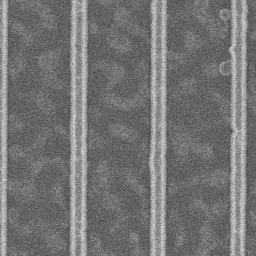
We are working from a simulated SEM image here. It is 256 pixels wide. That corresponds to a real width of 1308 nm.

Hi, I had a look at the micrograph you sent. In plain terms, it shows one or a few lines or trenches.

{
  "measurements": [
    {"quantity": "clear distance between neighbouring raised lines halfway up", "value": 67.3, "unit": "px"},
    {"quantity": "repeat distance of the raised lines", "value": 0.408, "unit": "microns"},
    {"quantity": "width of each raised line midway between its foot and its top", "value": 62.6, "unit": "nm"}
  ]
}